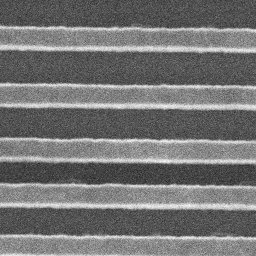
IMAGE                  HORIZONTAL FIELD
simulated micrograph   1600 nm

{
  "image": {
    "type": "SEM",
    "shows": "lines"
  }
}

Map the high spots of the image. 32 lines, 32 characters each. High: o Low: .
................................
................................
................................
ooooo.ooo.......................
oooooooooooooooooooooooooooooooo
oooooooooooooooooooooooooooooooo
................................
................................
................................
................................
................................
oooooooooooooooooooooooooooooooo
oooooooooooooooooooooooooooooooo
...............................o
................................
................................
................................
oooooooo.ooooo..................
oooooooooooooooooooooooooooooooo
oooooooooooooooooooooooooooooooo
................................
................................
................................
oooooooooooooooooooooooooooooooo
oooooooooooooooooooooooooooooooo
oooooooooooooooooooooooooooooooo
................................
................................
................................
oooo...o........................
oooooooooooooooooooooooooooooooo
oooooooooooooooooooooooooooooooo